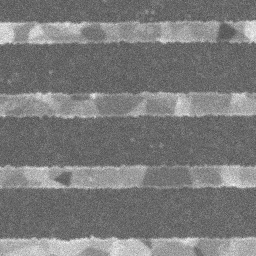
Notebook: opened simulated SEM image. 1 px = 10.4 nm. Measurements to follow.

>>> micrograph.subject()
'one or a few lines or trenches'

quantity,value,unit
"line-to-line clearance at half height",536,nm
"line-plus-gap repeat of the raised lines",752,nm